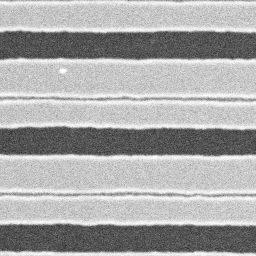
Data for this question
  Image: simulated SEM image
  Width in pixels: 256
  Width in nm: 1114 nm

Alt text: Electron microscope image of lines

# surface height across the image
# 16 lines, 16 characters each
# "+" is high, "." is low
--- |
++++++++++++++++
++++++++++++++++
................
................
++++++++++++++++
++++++++++++++++
++++++++++++++++
++++++++++++++++
................
................
++++++++++++++++
++++++++++++++++
++++++++++++++++
++++++++++++++++
................
................